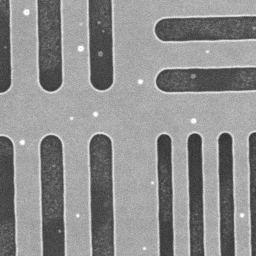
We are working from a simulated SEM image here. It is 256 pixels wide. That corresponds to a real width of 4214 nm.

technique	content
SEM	groups of lines, slits or small figures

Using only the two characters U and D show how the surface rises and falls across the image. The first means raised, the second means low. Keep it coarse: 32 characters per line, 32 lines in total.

DUUUUDDDUUUDDDUUUUUUUUUUUUUUUUUU
DUUUUDDDUUUDDDUUUUUUUUUUUUUUUUUU
DUUUUDDDUUUDDDUUUUUUDDDDDDDDDDDD
DUUUUDDDUUUDDDUUUUUDDDDDDDDDDDDD
DUUUUDDDUUUDDDUUUUUUDDDDDDDDDDDD
DUUUUDDDUUUDDDUUUUUUUUUUUUUUUUUU
DUUUUDDDUUUDDDUUUUUUUUUUUUUUUUUU
DUUUUDDDUUUDDDUUUUUUUUUUUUUUUUUU
DUUUUDDDUUUDDDUUUUUUUUUUDUDDDDDD
DUUUUDDDUUUDDDUUUUUUDDDDDDDDDDDD
DUUUUDDDUUUDDDUUUUUDDDDDDDDDDDDD
DUUUUUUUUUUUUUUUUUUUUDDDDDDUUUUU
UUUUUUUUUUUUUUUUUUUUUUUUUUUUUUUU
UUUUUUUUUUUUUUUUUUUUUUUUUUUUUUUU
UUUUUUUUUUUUUUUUUUUUUUUUUUUUUUUU
UUUUUUUUUUUUUUUUUUUUUUUUUUUUUUUU
UUUUUUUUUUUUUUUUUUUUUUUUUUUUUUUU
DUUUUDDDUUUDDDUUUUUUDUUDDUUDDUUD
DDUUUDDDUUUDDDUUUUUUDDUDDUUDDUUD
DDUUUDDDUUUDDDUUUUUUDDUDDUUDDUUD
DDUUUDDDUUUDDDUUUUUUDDUDDUUDDUUD
DDUUUDDDUUUDDDUUUUUUDDUDDUUDDUUD
DDUUUDDDUUUDDDUUUUUUDDUUDUUDDUUD
DDUUUDDDUUUDDDUUUUUUDDUUDDUDDUUD
DDUUUDDDUUUDDDUUUUUUDDUUDUUDDUUD
DDUUUDDDUUUDDDUUUUUUDDUUDDUDDUUD
DDUUUDDDUUUDDDUUUUUUDDUUDDUDDUUD
DDUUUDDDUUUDDDUUUUUUDDUUDDUDDUUD
DDUUUDDDUUUDDDUUUUUUDDUUDDUDDUUD
DDUUUDDDUUUDDDUUUUUUDDUUDDUDDUUD
DDUUUDDDUUUDDDUUUUUUDDUUDDUDDUUD
DDUUUDDDUUUDDDUUUUUUDDUUDDUDDUUD